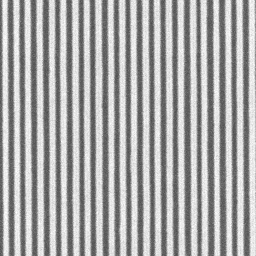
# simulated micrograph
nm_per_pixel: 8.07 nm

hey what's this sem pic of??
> parallel lines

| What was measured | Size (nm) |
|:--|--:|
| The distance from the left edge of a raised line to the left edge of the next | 94.8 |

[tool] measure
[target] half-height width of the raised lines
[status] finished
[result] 39.3 nm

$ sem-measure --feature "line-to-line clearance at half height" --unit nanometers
54.5